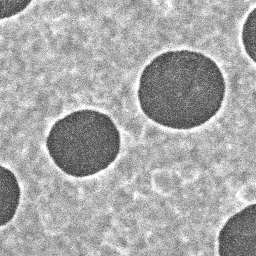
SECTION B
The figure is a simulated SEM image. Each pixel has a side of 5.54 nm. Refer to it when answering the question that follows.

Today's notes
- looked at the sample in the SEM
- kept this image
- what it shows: holes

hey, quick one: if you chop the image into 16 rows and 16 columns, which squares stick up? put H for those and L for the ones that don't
LLHHHHHHHHHHHHHH
HHHHHHHHHHHHHHHL
HHHHHHHHHHHHHHHL
HHHHHHHHHHLLLHHH
HHHHHHHHHLLLLLHH
HHHHHHHHHLLLLLHH
HHHHHHHHHLLLLLHH
HHHHLLLHHLLLLHHH
HHHLLLLLHHHHHHHH
HHHLLLLHHHHHHHHH
HHHHLLLHHHHHHHHH
LHHHHHHHHHHHHHHH
LHHHHHHHHHHHHHHH
LHHHHHHHHHHHHHHL
HHHHHHHHHHHHHHLL
HHHHHHHHHHHHHHLL